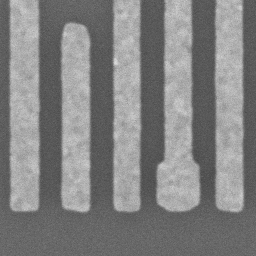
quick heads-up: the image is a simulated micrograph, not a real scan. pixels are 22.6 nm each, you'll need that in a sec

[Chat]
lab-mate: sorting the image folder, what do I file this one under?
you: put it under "wiring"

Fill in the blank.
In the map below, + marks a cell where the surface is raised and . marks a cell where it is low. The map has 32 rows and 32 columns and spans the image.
.++++.........+++....+++...+++..
.++++.........+++....+++...+++..
.++++.........+++....+++...+++..
.++++...+++...+++....+++...+++..
.++++...+++...+++....+++...+++..
.++++...+++...+++....+++...+++..
.++++...+++...+++....+++...+++..
.++++...+++...+++....+++...+++..
.++++...+++...+++....+++...+++..
.++++...+++...+++....+++...+++..
.++++...+++...+++....+++...+++..
.++++...+++...+++....+++...+++..
.++++...+++...+++....+++...+++..
.++++...+++...+++....+++...+++..
.++++...+++...+++....+++...+++..
.++++...+++...+++....+++...+++..
.++++...+++...+++....+++...+++..
.++++...+++...+++....+++...+++..
.++++...+++...+++....+++...+++..
.++++...+++...+++....+++...+++..
.++++...+++...+++...++++...+++..
.++++...+++...+++...+++++..+++..
.++++...+++...+++...+++++..+++..
.++++...+++...+++...+++++..+++..
.++++...+++...+++...+++++..+++..
.++++...+++...+++...+++++..+++..
................................
................................
................................
................................
................................
................................